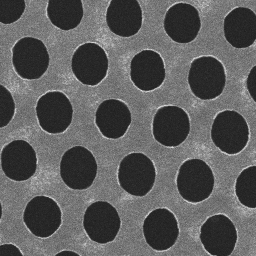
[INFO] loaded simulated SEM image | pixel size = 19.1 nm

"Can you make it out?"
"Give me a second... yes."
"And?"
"a regular array of holes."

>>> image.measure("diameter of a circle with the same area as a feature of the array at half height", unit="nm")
755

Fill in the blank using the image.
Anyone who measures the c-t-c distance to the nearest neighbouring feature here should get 1130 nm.